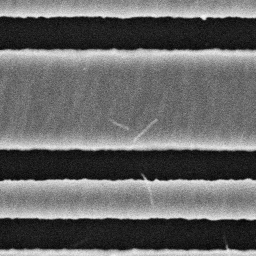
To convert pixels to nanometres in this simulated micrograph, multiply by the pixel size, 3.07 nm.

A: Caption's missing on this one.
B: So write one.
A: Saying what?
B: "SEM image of lines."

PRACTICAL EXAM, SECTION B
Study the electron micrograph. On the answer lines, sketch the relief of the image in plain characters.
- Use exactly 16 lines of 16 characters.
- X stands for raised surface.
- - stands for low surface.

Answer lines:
XXXXXXXXXXXXXXXX
----------------
----------------
XXXXXXXXXXXXXXXX
XXXXXXXXXXXXXXXX
XXXXXXXXXXXXXXXX
XXXXXXXXXXXXXXXX
XXXXXXXXXXXXXXXX
XXXXXXXXXXXXXXXX
----------------
----------------
XXXXXXXXXXXXXXXX
XXXXXXXXXXXXXXXX
XXXXXXXXXXXXXXXX
----------------
----------------